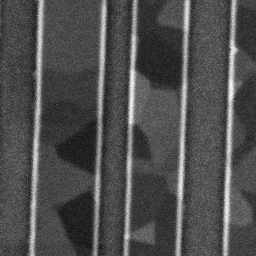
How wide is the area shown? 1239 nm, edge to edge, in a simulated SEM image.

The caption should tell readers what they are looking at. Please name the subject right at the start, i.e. one or a few lines or trenches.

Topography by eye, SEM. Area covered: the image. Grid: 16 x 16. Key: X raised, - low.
---XXXX-XXXX---X
---XXX--XXXX---X
--XXXX--XXXX---X
--XXXX--XXXX--XX
--XXXX--XXXX--XX
--XXXX--XXXX--XX
--XXXX--XXX---XX
--XXXX--XXX---XX
--XXXX--XXX---XX
--XXXX--XXX---XX
--XXXX--XXX---XX
--XXXX--XXX---XX
--XXXX--XXX---XX
--XXXX--XXX---XX
--XXXX--XXX---XX
--XXXX--XXX---XX